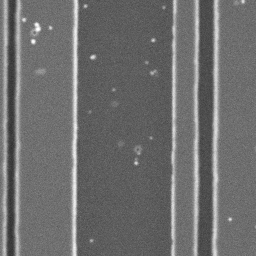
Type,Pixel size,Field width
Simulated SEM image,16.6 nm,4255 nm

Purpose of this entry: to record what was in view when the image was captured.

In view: lines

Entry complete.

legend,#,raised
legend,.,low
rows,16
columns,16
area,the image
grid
#####......#####
#####......#####
#####......#####
#####......#####
#####......#####
#####......#####
#####......#####
#####......#####
#####......#####
#####......#####
#####......#####
#####......#####
#####......#####
#####......#####
#####......#####
#####......#####